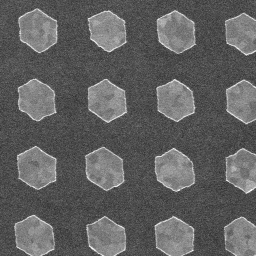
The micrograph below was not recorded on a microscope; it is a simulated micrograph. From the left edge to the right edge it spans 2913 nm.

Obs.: a regular array of raised bodies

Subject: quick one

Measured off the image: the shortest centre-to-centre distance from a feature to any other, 778 nanometers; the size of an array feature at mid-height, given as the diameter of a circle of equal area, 443 nanometers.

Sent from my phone